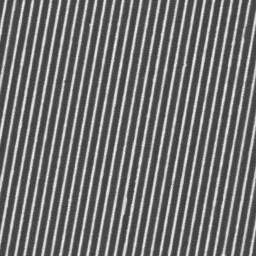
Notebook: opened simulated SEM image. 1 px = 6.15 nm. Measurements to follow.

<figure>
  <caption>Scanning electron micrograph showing parallel lines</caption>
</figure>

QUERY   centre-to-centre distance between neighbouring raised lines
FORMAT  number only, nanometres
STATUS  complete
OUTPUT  54.7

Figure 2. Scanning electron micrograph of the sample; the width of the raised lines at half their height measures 15.9 nanometres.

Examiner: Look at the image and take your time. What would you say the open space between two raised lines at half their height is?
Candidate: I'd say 36.3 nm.